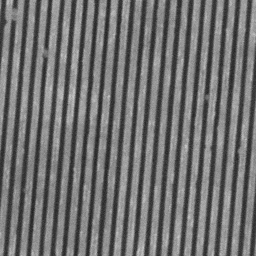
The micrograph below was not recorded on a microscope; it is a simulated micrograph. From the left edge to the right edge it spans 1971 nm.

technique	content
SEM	parallel lines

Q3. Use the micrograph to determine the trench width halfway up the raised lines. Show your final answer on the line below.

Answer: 45.1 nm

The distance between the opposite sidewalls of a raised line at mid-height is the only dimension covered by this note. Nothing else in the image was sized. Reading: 45.1 nanometers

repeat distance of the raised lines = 89.9 nanometres